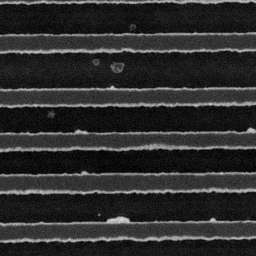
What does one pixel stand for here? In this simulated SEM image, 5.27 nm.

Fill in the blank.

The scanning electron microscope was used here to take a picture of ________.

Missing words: lines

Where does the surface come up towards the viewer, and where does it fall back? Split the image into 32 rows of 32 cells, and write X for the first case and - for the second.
---X----------------------------
--------------------------------
--------------------------------
--------------------------------
XXXXXXXXXXXXXXXXXXXXXXXXXXXXXXXX
XXXXXXXXXXXXXXXXXXXXXXXXXXXXXXXX
XXXXXXXXXXXXXXX-XXXXX-XXX-------
--------------------------------
--------------------------------
--------------------------------
--------------------------------
XXXXXXXXXXXXXXXXXXXXXXXXXXXXXXXX
XXXXXXXXXXXXXXXXXXXXXXXXXXXXXXXX
--------------------------------
--------------------------------
--------------------------------
----------------------------X---
XXXXXXXXXXXXXXXXXXXXXXXXXXXXXXXX
XXXXXXXXXXXXXXXXXXXXXXXXXXX-XXXX
--------------------------------
--------------------------------
--------------------------------
XXXXXXXXXXXXXXXXXXXXXXXXXXXXXXXX
XXXXXXXXXXXXXXXXXXXXXXXXXXXXXXXX
--------------------------------
--------------------------------
--------------------------------
--------------XX----------------
XXXXXXXXXXXXXXXXXXXXXXXXXXXXXXXX
XXXXXXXXXXXXXXXXXXXXXXXXXXXXXXXX
--------------------------------
--------------------------------